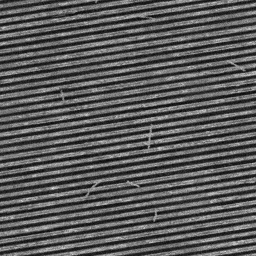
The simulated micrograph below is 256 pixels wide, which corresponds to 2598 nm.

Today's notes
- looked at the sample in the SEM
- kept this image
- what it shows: parallel lines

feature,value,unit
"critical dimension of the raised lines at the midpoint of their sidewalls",35.1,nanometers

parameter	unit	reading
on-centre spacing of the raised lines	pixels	7.51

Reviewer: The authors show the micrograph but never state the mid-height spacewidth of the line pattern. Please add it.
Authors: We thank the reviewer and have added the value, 42.6 nm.